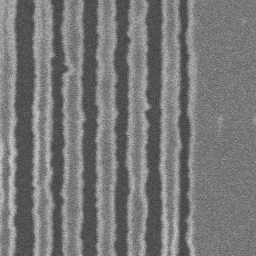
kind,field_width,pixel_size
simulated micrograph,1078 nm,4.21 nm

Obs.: parallel lines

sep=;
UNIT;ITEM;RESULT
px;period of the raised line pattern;31.9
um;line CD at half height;0.0647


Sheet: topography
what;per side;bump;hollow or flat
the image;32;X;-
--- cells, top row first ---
XX---X--XX--XX--XX--XX--XXXXXXXX
XX--XX--XX--XX--XX--XX--XXXXXXXX
XX--XX--XX--XX---X---X--XXXXXXXX
XX--XX--XX--XX--XX--XX--XXXXXXXX
XX--XX--XX--XX--XX--XX--XXXXXXXX
XX--XX--XX--XX--XX--XX--XXXXXXXX
XX--XX--XX--XX--XX---X--XXXXXXXX
XX--XX--XX--XX--XX---X--XXXXXXXX
XX---X---X---X--XX--XX--XXXXXXXX
XX---X--XX--XX--XX---X--XXXXXXXX
XX---X--XX--XX--XX--XX--XXXXXXXX
XX---X--XX--XX--XX--XX--XXXXXXXX
XX--XX--XX--XX--XX--XX--XXXXXXXX
XX--XX--XX---X--XX--XX--XXXXXXXX
XX--XX--XX--XX--XX--XX--XXXXXXXX
XX--XX--XX--XX--XX--XX--XXXXXXXX
XX--XX--XX--XX--XX--XX--XXXXXXXX
XX--XX--XX--XX--XX--XX--XXXXXXXX
XX--XX--XX--XX--XX--XX--XXXXXXXX
XX--XX--XX--XX--XX--XX--XXXXXXXX
X---XX--XX--XX--XX--XX--XXXXXXXX
-X--XX--XX--XX--XX--XX--XXXXXXXX
XX--XX--XX---X--XX--XX--XXXXXXXX
XX--XX--XX--XX--XX--XX--XXXXXXXX
XX---X--XX--XX--XX--XX--XXXXXXXX
XX--XX--XX--XX--XX--XX--XXXXXXXX
XX--XX--XX--XX--XX--XX--XXXXXXXX
XX---X--XX--XX--XX--XX--XXXXXXXX
XX--XX--XX--XX--XX--XX--XXXXXXXX
XX--XX--XX--XX--XX--XX--XXXXXXXX
XX--XX--XX--XX--XX--XX--XXXXXXXX
XX--XX--XX--XX--XX--XX--XXXXXXXX